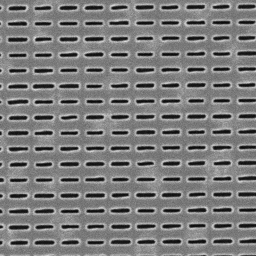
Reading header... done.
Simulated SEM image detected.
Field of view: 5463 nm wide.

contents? a regular array of holes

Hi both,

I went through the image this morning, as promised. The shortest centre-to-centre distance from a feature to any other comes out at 330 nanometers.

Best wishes